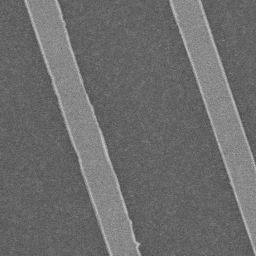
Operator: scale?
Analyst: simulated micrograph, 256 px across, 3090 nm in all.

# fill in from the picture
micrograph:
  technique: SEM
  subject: one or a few lines or trenches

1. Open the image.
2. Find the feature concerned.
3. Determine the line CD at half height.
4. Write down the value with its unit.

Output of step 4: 332 nm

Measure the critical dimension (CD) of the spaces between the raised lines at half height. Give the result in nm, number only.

1320